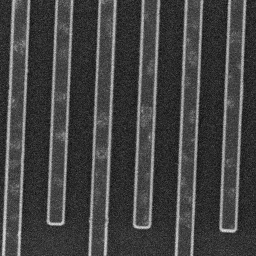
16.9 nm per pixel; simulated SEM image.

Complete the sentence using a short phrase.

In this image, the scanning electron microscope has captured parallel lines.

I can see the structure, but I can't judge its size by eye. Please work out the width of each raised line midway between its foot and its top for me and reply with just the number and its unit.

15.5 px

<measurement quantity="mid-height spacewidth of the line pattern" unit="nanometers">465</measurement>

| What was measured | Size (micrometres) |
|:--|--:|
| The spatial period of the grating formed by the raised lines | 0.73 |